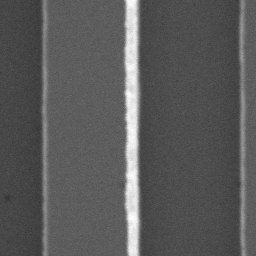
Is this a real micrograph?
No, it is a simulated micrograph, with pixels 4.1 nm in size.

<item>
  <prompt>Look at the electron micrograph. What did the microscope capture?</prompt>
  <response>lines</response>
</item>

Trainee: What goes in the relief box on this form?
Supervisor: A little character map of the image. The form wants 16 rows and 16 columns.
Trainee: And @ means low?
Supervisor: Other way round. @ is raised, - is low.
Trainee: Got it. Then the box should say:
---@@@@@-------@
---@@@@@-------@
---@@@@@@------@
---@@@@@-------@
---@@@@@@------@
---@@@@@@------@
---@@@@@-------@
---@@@@@@------@
---@@@@@@------@
---@@@@@@------@
---@@@@@@------@
---@@@@@@------@
---@@@@@@------@
---@@@@@@------@
---@@@@@@------@
---@@@@@@------@